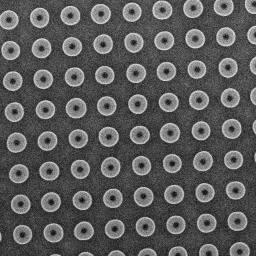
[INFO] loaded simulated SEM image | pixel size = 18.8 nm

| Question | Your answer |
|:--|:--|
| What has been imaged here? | an array of small figures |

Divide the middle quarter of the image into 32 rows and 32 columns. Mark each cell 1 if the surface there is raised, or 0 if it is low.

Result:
00000000000000000111000011100001
01110000111100001111000111110001
11111000111100001111000111110001
11111000111100001111000011100000
01111000011100000110000000000000
00100000000000000000000000000000
00000000000000000000000000000000
00000000000000000000000001100000
00000000011100000111000011110001
01111000011110001111100011111001
01111000111110001111100011110000
01111000011110000111000001110000
01111000011100000000000000000000
00000000000000000000000000000000
00000000000000000000000000000000
00000000000000000000000001110000
00010000011110000111100011111000
00111100011110000111100011111000
01111100011111000111100011111000
01111100011110000111000000100000
00111000000100000000000000000000
00000000000000000000000000000000
00000000000000000000000000000000
00000000000110000011100001111000
00011000001111000111110001111000
00111100011111000111110001111000
00111100011111000111110000111000
00111100001110000011100000000000
00011000000000000000000000000000
00000000000000000000000000000000
00000000000000000000000000011000
00000000000110000011110001111100